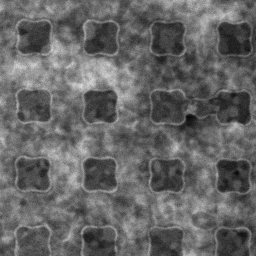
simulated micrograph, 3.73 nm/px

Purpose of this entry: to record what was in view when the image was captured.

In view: a regular array of raised bodies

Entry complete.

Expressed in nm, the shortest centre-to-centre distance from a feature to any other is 249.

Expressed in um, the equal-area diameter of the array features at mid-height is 0.142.